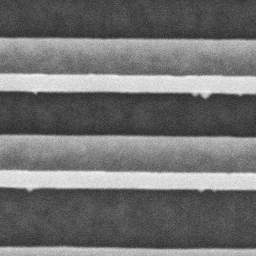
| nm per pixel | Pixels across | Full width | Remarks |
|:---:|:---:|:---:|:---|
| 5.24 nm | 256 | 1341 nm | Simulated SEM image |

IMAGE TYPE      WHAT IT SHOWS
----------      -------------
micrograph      lines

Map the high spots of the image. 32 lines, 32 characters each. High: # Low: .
................................
................................
................................
................................
................................
################################
################################
################################
################################
################################
################################
....#...................########
................................
................................
................................
................................
................................
################################
################################
################################
################################
################################
################################
...#.............###############
................................
................................
................................
................................
................................
................................
................................
################################